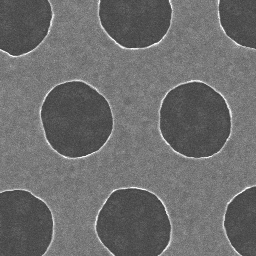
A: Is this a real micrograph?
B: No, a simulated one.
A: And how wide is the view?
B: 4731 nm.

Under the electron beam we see holes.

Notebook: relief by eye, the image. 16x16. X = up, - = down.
---XXX-----XXX--
---XXX-----XXX--
---XXXX---XXXXX-
XXXXXXXXXXXXXXXX
XXXXXXXXXXXXXXXX
XXX---XXXXX--XXX
XXX----XXX----XX
XXX----XXX----XX
XXX----XXX----XX
XXXX--XXXXX---XX
XXXXXXXXXXXXXXXX
XXXXXXXXXXXXXXXX
--XXXXX---XXXXX-
---XXX----XXXX--
---XXX-----XXX--
---XXXX---XXXXX-